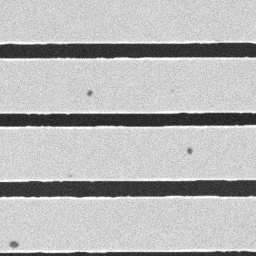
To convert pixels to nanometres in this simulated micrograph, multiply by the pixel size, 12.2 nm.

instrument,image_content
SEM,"lines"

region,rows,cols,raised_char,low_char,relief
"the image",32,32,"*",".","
********************************
********************************
********************************
********************************
********************************
................................
................................
********************************
********************************
********************************
********************************
********************************
********************************
********************************
................................
................................
********************************
********************************
********************************
********************************
********************************
********************************
*************************...**..
................................
................................
********************************
********************************
********************************
********************************
********************************
********************************
**************..................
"